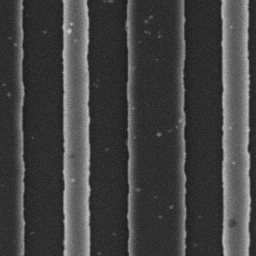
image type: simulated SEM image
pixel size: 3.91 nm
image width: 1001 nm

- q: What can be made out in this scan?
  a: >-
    lines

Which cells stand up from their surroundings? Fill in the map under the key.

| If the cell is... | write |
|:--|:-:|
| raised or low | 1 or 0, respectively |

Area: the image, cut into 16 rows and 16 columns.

1000100011100011
1000110011110011
1000110011110010
1000100011110011
1000110011100011
1000110011100011
1000110011100011
1000110011110011
1000110011110011
1000110011110011
1000110011110011
1000110011110011
1000110011110011
1000110011110011
1000110011110011
1000110011110011